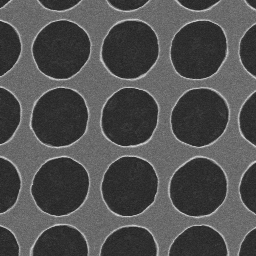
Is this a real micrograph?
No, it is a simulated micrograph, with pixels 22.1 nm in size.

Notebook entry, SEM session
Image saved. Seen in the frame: a regular array of holes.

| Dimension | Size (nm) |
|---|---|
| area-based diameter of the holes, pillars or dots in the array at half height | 1270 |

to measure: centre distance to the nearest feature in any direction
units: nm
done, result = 1500